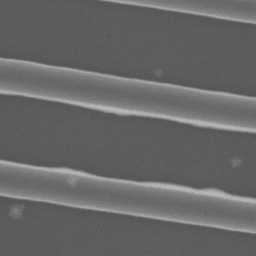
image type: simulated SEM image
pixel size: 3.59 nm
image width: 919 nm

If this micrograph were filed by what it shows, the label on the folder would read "lines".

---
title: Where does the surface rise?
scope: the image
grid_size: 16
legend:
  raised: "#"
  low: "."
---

..........######
................
................
................
#####...........
############....
.....###########
...........#####
................
................
##..............
#########.......
..##############
.........#######
...............#
................